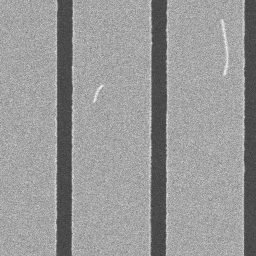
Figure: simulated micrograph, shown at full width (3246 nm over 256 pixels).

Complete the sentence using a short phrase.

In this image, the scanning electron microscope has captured lines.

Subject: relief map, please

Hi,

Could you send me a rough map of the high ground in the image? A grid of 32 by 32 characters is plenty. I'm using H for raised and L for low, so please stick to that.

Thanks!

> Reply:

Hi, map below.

HHHHHHHLLHHHHHHHHHHLLHHHHHHHHHHL
HHHHHHHLLHHHHHHHHHHLLHHHHHHHHHHL
HHHHHHHLLHHHHHHHHHHLLHHHHHHHHHHL
HHHHHHHLLHHHHHHHHHHLLHHHHHHHHHHL
HHHHHHHLLHHHHHHHHHHLLHHHHHHHHHHL
HHHHHHHLLHHHHHHHHHHLLHHHHHHHHHHL
HHHHHHHLLHHHHHHHHHHLLHHHHHHHHHHL
HHHHHHHLLHHHHHHHHHHLLHHHHHHHHHHL
HHHHHHHLLHHHHHHHHHHLLHHHHHHHHHHL
HHHHHHHLLHHHHHHHHHHLLHHHHHHHHHHL
HHHHHHHLLHHHHHHHHHHLLHHHHHHHHHHL
HHHHHHHLLHHHHHHHHHHLLHHHHHHHHHHL
HHHHHHHLLHHHHHHHHHHLLHHHHHHHHHHL
HHHHHHHLLHHHHHHHHHHLLHHHHHHHHHHL
HHHHHHHLLHHHHHHHHHHLLHHHHHHHHHHL
HHHHHHHLLHHHHHHHHHHLLHHHHHHHHHHL
HHHHHHHLLHHHHHHHHHHLLHHHHHHHHHHL
HHHHHHHLLHHHHHHHHHHLLHHHHHHHHHHL
HHHHHHHLLHHHHHHHHHHLLHHHHHHHHHHL
HHHHHHHLLHHHHHHHHHHLLHHHHHHHHHHL
HHHHHHHLLHHHHHHHHHHLLHHHHHHHHHHL
HHHHHHHLLHHHHHHHHHHLLHHHHHHHHHHL
HHHHHHHLLHHHHHHHHHHLLHHHHHHHHHLL
HHHHHHHLLHHHHHHHHHHLLHHHHHHHHHLL
HHHHHHHLLHHHHHHHHHHLLHHHHHHHHHLL
HHHHHHHLLHHHHHHHHHHLLHHHHHHHHHLL
HHHHHHHLLHHHHHHHHHHLLHHHHHHHHHLL
HHHHHHHLLHHHHHHHHHHLLHHHHHHHHHLL
HHHHHHHLLHHHHHHHHHHLLHHHHHHHHHLL
HHHHHHHLLHHHHHHHHHHLLHHHHHHHHHLL
HHHHHHHLLHHHHHHHHHHLLHHHHHHHHHLL
HHHHHHHLLHHHHHHHHHHLLHHHHHHHHHLL